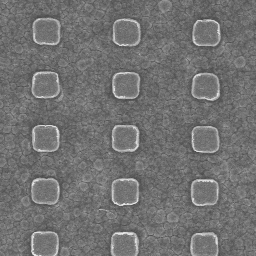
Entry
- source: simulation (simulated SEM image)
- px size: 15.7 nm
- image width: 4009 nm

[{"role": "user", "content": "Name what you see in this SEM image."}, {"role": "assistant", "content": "a regular array of raised bodies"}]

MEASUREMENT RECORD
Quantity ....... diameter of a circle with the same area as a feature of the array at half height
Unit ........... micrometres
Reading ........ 0.451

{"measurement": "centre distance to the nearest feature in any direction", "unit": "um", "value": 0.829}